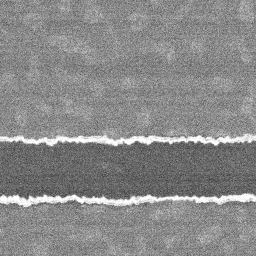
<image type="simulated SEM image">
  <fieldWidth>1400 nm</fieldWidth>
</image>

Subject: one or a few lines or trenches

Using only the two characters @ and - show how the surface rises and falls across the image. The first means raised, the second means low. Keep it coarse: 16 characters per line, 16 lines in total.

@@@@@@@@@@@@@@@@
@@@@@@@@@@@@@@@@
@@@@@@@@@@@@@@@@
@@@@@@@@@@@@@@@@
@@@@@@@@@@@@@@@@
@@@@@@@@@@@@@@@@
@@@@@@@@@@@@@@@@
@@@@@@@@@@@@@@@@
@@@@@@@@@@@@@@@@
----------------
----------------
----------------
@@@@@@@-@@@@@@@@
@@@@@@@@@@@@@@@@
@@@@@@@@@@@@@@@@
@@@@@@@@@@@@@@@@